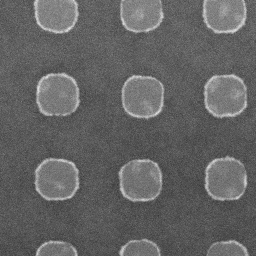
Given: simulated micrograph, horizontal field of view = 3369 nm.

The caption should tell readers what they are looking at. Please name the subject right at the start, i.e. raised bodies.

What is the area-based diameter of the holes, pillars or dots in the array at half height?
570 nm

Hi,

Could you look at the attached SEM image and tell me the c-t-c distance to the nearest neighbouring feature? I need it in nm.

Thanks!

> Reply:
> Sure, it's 1100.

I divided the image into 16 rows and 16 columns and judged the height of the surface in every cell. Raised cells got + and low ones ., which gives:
..+++...++...++.
...++...++...++.
................
................
................
..+++...++...++.
..+++...++...++.
................
................
................
..+++...++...++.
..+++...++...++.
........+.......
................
................
...++...++...++.